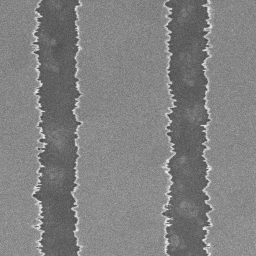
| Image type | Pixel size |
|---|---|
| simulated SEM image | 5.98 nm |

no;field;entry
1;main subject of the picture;one or a few lines or trenches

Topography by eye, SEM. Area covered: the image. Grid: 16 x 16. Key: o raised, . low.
oo...oooooo..ooo
oo...oooooo..ooo
oo...oooooo..ooo
oo...oooooo..ooo
oo...oooooo..ooo
oo...oooooo..ooo
oo...oooooo..ooo
ooo..oooooo..ooo
ooo..oooooo..ooo
ooo..oooooo..ooo
ooo..oooooo..ooo
oo...oooooo..ooo
oo...ooooo...ooo
ooo..ooooo...ooo
ooo..ooooo...ooo
ooo..ooooo...ooo